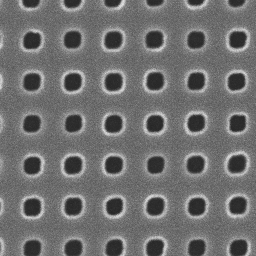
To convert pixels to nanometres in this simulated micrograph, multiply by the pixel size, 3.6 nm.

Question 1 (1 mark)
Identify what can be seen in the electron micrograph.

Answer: a regular array of holes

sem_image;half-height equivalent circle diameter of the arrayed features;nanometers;65.2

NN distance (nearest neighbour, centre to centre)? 147 nm